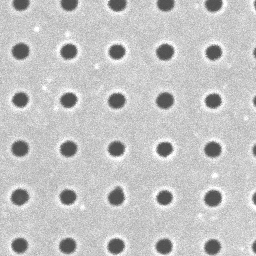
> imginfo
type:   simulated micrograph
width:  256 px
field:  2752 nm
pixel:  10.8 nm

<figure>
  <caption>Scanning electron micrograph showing a regular array of holes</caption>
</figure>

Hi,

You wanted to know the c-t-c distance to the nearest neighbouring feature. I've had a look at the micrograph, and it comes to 516 nm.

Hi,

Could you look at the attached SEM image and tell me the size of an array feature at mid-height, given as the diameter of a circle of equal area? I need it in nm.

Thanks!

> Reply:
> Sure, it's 191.